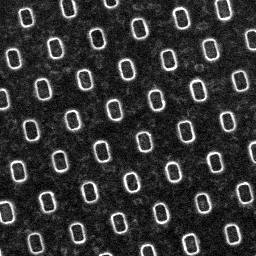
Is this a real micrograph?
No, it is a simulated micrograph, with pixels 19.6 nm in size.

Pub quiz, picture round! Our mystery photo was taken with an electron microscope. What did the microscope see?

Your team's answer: a regular array of holes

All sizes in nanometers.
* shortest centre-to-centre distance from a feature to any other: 830